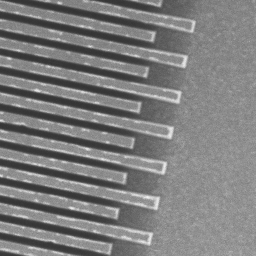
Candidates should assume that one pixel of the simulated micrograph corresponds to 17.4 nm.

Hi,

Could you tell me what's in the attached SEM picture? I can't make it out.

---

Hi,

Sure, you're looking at parallel lines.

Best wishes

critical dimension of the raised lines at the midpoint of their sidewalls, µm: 0.196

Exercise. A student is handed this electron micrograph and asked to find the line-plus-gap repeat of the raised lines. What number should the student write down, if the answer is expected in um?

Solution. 0.314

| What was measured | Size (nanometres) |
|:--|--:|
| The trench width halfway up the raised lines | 122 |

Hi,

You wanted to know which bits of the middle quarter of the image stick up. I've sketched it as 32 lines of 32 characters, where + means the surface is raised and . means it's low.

.......++++++++++++.........++..
++........+++++++++++...........
+++++++.........+++++...........
++++++++++++....................
...++++++++++++++...............
........++++++++++++++..........
++++.........++++++++++++++.....
+++++++++.........+++++++++++...
++++++++++++++.........++++++...
.....++++++++++++++.............
+.........+++++++++.............
++++++.........++++.............
+++++++++++.....................
..+++++++++++++.................
.......+++++++++++++............
++..........+++++++++++++.......
+++++++.........+++++++++++.....
++++++++++++.........++++++.....
...++++++++++++++...............
........+++++++++...............
+++++.........+++...............
++++++++++......................
.++++++++++++++.................
......+++++++++++++.............
++.........++++++++++++++.......
+++++++.........+++++++++.......
++++++++++++.........++++.......
...++++++++++++.................
........+++++++.................
+++..........++.................
++++++++........................
+++++++++++++...................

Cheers